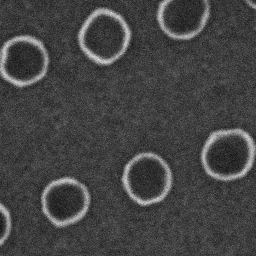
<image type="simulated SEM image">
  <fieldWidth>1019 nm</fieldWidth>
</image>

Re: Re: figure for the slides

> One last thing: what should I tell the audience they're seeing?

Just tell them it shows raised bodies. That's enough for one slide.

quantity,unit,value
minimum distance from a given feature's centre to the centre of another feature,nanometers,338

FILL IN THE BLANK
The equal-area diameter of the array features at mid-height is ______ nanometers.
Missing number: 196